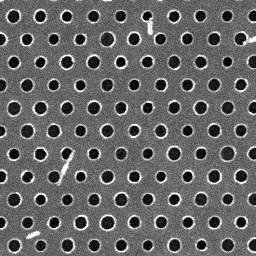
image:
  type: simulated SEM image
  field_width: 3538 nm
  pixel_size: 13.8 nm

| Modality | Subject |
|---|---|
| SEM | a regular array of holes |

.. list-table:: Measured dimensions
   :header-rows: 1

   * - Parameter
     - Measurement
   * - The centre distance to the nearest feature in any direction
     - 0.363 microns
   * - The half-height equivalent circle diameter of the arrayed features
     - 160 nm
